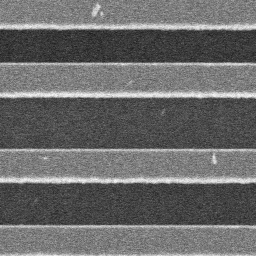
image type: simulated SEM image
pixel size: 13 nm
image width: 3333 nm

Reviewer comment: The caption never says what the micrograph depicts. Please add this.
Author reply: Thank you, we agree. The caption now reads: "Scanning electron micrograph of lines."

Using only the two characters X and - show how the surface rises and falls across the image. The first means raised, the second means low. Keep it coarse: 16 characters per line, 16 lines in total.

XXXXXXXXXXXXXXXX
XXXXXXXXXXXXXXXX
----------------
----------------
XXXXXXXXXXXXXXXX
XXXXXXXXXXXXXXXX
----------------
----------------
----------------
XXXXXXXXXXXXXXXX
XXXXXXXXXXXXXXXX
----------------
----------------
----------------
XXXXXXXXXXXXXXXX
XXXXXXXXXXXXXXXX